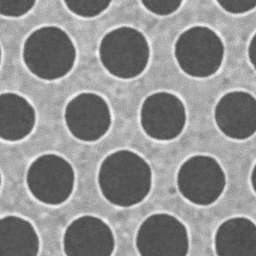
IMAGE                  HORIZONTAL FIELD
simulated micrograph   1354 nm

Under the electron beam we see a regular array of holes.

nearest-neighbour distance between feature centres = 389 nanometres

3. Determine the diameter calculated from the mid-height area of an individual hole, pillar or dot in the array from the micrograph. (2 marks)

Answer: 272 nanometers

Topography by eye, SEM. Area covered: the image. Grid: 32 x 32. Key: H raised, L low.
LLLLHHHHLLLLLLHHHHLLLLLHHHHLLLLL
LLLLHHHHHLLLLHHHHHHLLLHHHHHHLLLH
HHHHHHHHHHHHHHHHHHHHHHHHHHHHHHHH
HHHHHLLLHHHHHHLLLHHHHHHHLLHHHHHH
HHHHLLLLLHHHHLLLLLHHHHLLLLLHHHHH
HHHLLLLLLHHHLLLLLLLHHHLLLLLLHHHL
HHHLLLLLLLHHLLLLLLLHHHLLLLLLHHHL
HHHLLLLLLLHHLLLLLLLHHHLLLLLLHHHL
HHHLLLLLLHHHHLLLLLHHHHHLLLLLHHHH
HHHHLLLLHHHHHHLLLHHHHHHHLLHHHHHH
HHHHHHHHHHHHHHHHHHHHHHHHHHHHHHHH
HLHHHHHHHHLHHHHHHHHHLHHHHHHHLLLH
LLLHHHHHHLLLLHHHHHLLLLLHHHHLLLLL
LLLLHHHHLLLLLLHHHHLLLLLHHHHLLLLL
LLLLLHHHLLLLLLHHHLLLLLLHHHHLLLLL
LLLLHHHHLLLLLLHHHHLLLLLHHHHLLLLL
LLLLHHHHHLLLLHHHHHLLLLLHHHHHLLLL
LLLHHHHHHHLLHHHHHHHLLLHHHHHHHHHH
HHHHHHHHHHHHHHHHHHHHHHHHHHHHHHHH
HHHHHLLLHHHHHLLLLLHHHHHHLLHHHHHH
HHHHLLLLLHHHHLLLLLLHHHHLLLLHHHHH
HHHLLLLLLHHHLLLLLLLHHHLLLLLLHHHL
HHHLLLLLLHHHLLLLLLLHHHLLLLLLHHHL
HHHLLLLLLHHHLLLLLLLHHHLLLLLLHHHH
HHHHLLLLLHHHHLLLLLHHHHHLLLLLHHHH
HHHHHLLLHHHHHHLLLHHHHHHHLLLHHHHH
HHHHHHHHHHHHHHHHHHHHHHHHHHHHHHHH
LLLHHHHHHLLLLHHHHHLLLLHHHHHHLLLH
LLLLHHHHLLLLLLHHHLLLLLLHHHHLLLLL
LLLLLHHHLLLLLLHHHLLLLLLLHHHLLLLL
LLLLLHHHLLLLLLHHHLLLLLLLHHHLLLLL
LLLLLHHHLLLLLLHHHLLLLLLLHHHLLLLL